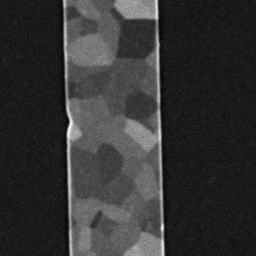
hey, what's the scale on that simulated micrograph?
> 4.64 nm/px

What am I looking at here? one or a few lines or trenches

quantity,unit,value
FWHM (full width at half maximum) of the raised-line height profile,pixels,92.7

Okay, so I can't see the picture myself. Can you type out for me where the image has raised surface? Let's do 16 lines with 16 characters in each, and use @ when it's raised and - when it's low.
----@@@@@@------
----@@@@@@------
----@@@@@@------
----@@@@@@------
----@@@@@@------
----@@@@@@------
----@@@@@@------
----@@@@@@------
----@@@@@@------
----@@@@@@------
----@@@@@@------
----@@@@@@------
----@@@@@@------
----@@@@@@------
----@@@@@@------
----@@@@@@------